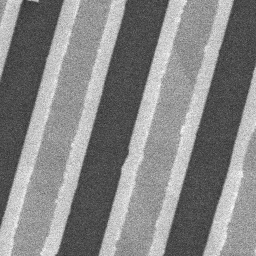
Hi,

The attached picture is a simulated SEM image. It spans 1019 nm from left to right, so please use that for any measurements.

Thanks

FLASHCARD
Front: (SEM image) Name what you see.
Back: one or a few lines or trenches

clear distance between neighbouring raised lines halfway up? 210 nm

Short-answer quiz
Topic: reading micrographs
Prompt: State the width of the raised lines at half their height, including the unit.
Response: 192 nm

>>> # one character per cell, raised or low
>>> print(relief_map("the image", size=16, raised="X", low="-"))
X---XXX----XXX--
X---XXX----XXX--
----XXX---XXX---
---XXX----XXX---
---XXX----XXX---
---XXX---XXXX---
---XXX---XXX----
--XXX----XXX---X
--XXX----XXX---X
--XXX---XXX----X
--XXX---XXX----X
-XXX----XXX---XX
-XXX----XXX---XX
-XXX---XXX----XX
XXX----XXX----XX
XXX----XXX---XXX